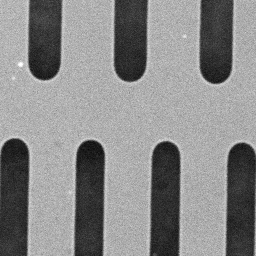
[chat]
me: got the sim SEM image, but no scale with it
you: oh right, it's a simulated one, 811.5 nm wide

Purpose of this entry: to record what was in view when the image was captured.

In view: groups of lines, slits or small figures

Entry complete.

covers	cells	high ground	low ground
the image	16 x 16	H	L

HHLLHHHLLHHHLLLH
HHLLHHHLLHHHLLLH
HHLLHHHLLHHHLLLH
HHLLHHHLLHHHLLLH
HHLLHHHLLHHHHLHH
HHHHHHHHHHHHHHHH
HHHHHHHHHHHHHHHH
HHHHHHHHHHHHHHHH
HHHHHHHHHHHHHHHH
LLHHHLLHHHLHHHLL
LLHHHLLHHLLHHHLL
LLHHHLLHHLLHHHLL
LLHHHLLHHLLHHHLL
LLHHHLLHHLLHHHLL
LLHHHLLHHLLHHHLL
LLHHHLLHHLLHHHLL